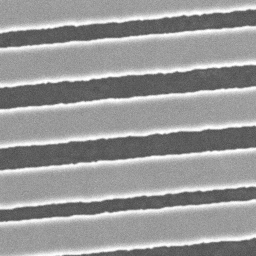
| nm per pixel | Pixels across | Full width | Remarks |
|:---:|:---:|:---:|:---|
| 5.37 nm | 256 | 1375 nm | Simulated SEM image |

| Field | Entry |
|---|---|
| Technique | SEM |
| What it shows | lines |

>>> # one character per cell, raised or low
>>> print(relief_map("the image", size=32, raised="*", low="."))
********************************
*****************************...
****************................
******.......................***
.................***************
......**************************
********************************
********************************
**************************......
***************.................
*****...........................
.........................*******
.............*******************
..******************************
********************************
********************************
**********************..........
***********.....................
................................
....................************
..........**********************
********************************
********************************
****************************....
*****************...............
******....................******
...............*****************
...*****************************
********************************
********************************
*************************.......
*************...................